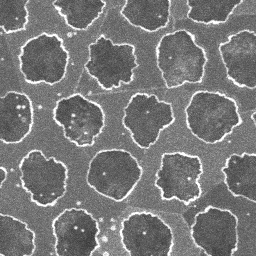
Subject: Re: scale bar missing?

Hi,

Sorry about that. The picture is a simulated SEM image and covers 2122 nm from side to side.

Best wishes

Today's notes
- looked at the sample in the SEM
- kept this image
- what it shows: a regular array of holes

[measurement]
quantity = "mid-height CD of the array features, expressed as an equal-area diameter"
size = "393 nanometres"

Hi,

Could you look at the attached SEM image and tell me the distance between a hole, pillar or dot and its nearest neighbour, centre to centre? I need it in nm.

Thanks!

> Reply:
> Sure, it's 537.